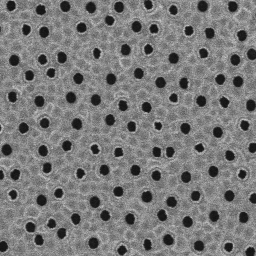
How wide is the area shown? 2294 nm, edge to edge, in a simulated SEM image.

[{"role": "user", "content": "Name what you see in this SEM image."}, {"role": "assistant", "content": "a regular array of holes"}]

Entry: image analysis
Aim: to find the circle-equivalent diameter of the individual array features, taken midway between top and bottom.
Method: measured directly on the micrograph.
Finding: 0.0944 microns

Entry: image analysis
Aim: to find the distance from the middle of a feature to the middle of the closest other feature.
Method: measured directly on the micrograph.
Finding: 193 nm